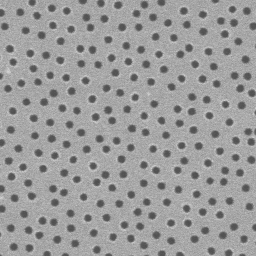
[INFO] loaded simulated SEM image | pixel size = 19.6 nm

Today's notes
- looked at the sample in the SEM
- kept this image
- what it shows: a regular array of holes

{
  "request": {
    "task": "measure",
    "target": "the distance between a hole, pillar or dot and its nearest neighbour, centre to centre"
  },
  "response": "294 nanometres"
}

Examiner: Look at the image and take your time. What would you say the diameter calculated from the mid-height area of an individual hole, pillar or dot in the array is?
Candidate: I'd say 0.161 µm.